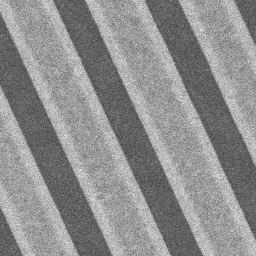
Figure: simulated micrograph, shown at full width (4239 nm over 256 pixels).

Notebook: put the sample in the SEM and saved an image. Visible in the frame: one or a few lines or trenches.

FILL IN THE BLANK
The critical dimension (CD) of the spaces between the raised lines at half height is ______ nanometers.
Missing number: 658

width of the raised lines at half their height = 724 nm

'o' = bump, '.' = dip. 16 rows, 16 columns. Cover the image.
ooo...ooo...ooo.
.ooo..ooo...ooo.
.ooo...ooo...oo.
..ooo..ooo...ooo
..ooo...ooo...oo
...ooo..ooo...oo
...ooo...ooo..oo
o..ooo...ooo...o
o...ooo...ooo..o
oo..ooo...ooo...
oo...ooo..oooo..
ooo..ooo...ooo..
ooo...ooo..ooo..
.oo...ooo...ooo.
.ooo...ooo..ooo.
..oo...ooo...ooo